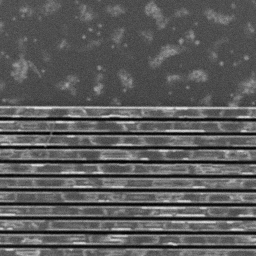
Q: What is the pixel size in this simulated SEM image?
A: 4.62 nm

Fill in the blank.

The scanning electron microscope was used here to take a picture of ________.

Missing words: parallel lines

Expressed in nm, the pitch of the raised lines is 65.5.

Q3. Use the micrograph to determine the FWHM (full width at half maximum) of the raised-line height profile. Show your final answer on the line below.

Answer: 47.4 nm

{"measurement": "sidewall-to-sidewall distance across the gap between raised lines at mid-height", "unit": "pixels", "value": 3.74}